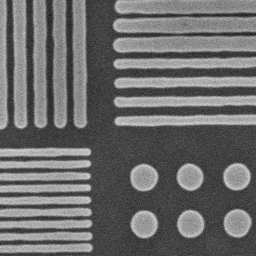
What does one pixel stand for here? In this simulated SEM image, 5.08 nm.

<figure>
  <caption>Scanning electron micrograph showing groups of lines, slits or small figures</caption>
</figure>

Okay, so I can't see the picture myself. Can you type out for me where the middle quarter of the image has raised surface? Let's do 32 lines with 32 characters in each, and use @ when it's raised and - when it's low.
---@@--------@@@@@@@@@@@@@@@@@@@
---@@@--------------------------
---@@@--------------------------
---@@@------------------@-------
---@@@-------@@@@@@@@@@@@@@@@@@@
---@@--------@@@@@@@@@@@@@@@----
---@@---------------------------
---@@---------------------------
---@@--------@@@@@@@@@@@@@@@@@@@
---@@--------@@@@@@@@@@@@@@@@@@@
---@@--------@@@@@@@@@@@---@@---
---@@---------------------------
---@@---------------------------
---@@@-------@@@@@@@@@@@@@@@@@@@
---@@@-------@@@@@@@@@@@@@@@@@@@
---@@---------------------------
--------------------------------
--------------------------------
--------------------------------
--------------------------------
--------------------------------
@@@@@@--------------------------
@@@@@@--------------------------
--------------------------------
@@@@@@--------------------------
@@@@@@-------------@@---------@@
-----------------@@@@@@------@@@
@@@@@@-----------@@@@@@-----@@@@
@@@@@@-----------@@@@@@-----@@@@
-----------------@@@@@@------@@@
@@@@@@-----------@@@@@@------@@@
@@@@@@--------------------------